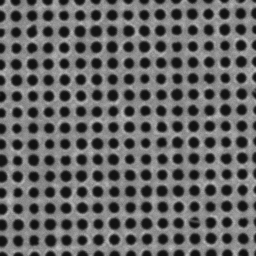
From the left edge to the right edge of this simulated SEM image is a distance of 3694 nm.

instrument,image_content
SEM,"a regular array of holes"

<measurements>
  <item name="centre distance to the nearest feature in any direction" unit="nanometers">228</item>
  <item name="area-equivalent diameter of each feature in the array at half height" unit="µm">0.161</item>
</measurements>